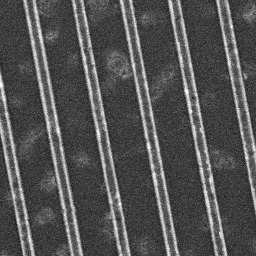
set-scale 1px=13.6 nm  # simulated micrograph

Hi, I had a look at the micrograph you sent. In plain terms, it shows parallel lines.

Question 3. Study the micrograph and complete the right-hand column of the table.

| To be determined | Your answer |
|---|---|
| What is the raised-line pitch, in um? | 0.643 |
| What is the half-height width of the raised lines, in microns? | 0.134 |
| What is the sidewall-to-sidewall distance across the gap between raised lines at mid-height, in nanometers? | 511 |